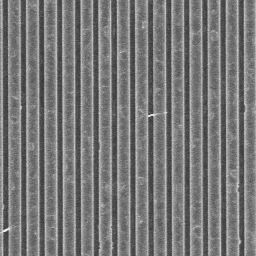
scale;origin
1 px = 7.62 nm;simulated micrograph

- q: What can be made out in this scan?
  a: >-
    parallel lines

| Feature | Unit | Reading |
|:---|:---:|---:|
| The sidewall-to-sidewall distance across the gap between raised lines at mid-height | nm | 45.7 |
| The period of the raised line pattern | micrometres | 0.138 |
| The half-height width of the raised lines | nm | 90.5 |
